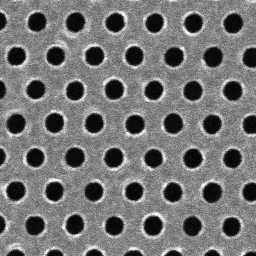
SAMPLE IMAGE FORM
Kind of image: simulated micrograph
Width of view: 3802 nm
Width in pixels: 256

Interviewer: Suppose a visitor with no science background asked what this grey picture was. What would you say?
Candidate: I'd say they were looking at a regular array of holes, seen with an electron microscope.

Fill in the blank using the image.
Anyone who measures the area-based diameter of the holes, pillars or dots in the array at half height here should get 302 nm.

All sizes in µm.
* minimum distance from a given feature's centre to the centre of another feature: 0.574